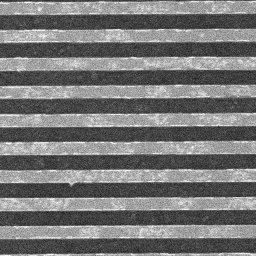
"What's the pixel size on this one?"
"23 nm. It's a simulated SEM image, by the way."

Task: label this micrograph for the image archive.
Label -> parallel lines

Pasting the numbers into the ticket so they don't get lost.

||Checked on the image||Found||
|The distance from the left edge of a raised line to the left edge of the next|28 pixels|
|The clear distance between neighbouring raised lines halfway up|354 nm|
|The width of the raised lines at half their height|288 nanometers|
